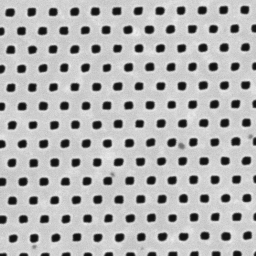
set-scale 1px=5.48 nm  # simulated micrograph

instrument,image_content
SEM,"a regular array of holes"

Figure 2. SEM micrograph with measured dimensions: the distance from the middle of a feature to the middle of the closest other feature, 116 nm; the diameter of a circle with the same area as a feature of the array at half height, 0.051 um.